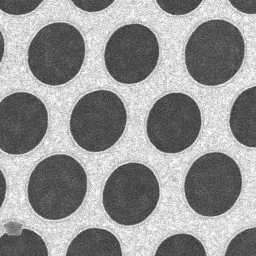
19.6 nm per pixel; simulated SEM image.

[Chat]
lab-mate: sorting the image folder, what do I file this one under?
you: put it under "a regular array of holes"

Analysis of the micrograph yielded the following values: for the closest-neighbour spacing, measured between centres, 1460 nm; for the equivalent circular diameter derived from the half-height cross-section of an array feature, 1180 nm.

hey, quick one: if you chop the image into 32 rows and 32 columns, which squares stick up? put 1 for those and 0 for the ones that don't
00000111100000111111000001111000
00001111111011111111100011111100
11111111111111111111111111001111
11111000011111100001111110000011
11110000001111000001111100000011
01110000000110000000111000000001
11110000000110000000111000000001
11100000000110000000111000000011
11110000001110000001111000000011
11110000011111000001111100000111
11111100111111111111111110001111
11011111111000111111111111111100
00000111110000011111000011111000
00000011100000001110000001111000
00000011100000001100000001111000
00000011100000001100000001111000
00000011100000011100000001111000
00000111100000011110000011111100
00001111110000111110000111111111
11111100011111111111111110000111
11111000001111110011111100000011
11110000000111000001111000000011
01110000000110000000111000000011
01100000000110000000111000000011
01100000000110000000111000000011
11110000001110000000111100000111
11110000011110000001111100001111
11111101111111000011111111111111
11111111111011111111111111111110
00000111100000111111100011111000
00000011100000011111000001111000
00000011000000011110000000110000